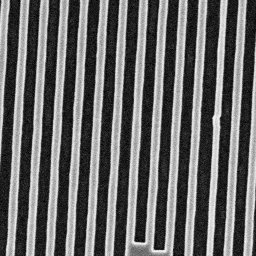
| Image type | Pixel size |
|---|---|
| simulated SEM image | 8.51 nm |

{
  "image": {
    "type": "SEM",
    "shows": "parallel lines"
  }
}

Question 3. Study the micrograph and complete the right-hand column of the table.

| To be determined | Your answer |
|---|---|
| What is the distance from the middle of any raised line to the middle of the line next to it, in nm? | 168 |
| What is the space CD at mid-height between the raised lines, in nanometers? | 104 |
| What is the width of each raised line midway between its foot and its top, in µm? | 0.0648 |